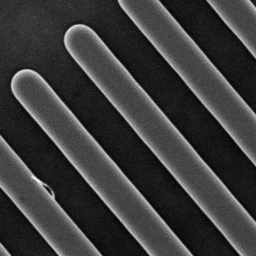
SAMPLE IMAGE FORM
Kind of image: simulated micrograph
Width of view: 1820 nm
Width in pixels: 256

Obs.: groups of lines, slits or small figures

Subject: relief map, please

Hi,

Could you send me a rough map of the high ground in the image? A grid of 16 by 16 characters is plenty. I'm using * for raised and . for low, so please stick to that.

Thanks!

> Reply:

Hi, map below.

........**...***
........***...**
....**...***...*
.....**...***...
.*...***...***..
.**...***...***.
.***...***...**.
..***...***...**
...***...**...**
*...***...**...*
**...**...***...
***...**...***..
.**...***...***.
..**...***...***
..***...***...**
...***...***...*